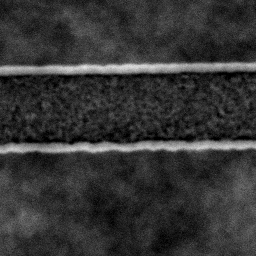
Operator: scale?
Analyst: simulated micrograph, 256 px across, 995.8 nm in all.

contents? one or a few lines or trenches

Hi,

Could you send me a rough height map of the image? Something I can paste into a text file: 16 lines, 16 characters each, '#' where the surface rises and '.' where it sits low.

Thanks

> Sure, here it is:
################
################
################
################
................
................
................
................
................
################
################
################
################
################
################
################